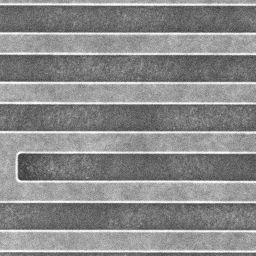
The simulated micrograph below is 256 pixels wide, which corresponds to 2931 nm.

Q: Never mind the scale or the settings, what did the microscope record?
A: groups of lines, slits or small figures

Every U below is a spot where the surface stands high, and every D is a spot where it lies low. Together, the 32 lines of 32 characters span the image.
UUUUUUUUUUUUUUUUUUUUUUUUUUUUUUUU
DDDDDDDDDDDDDDDDDDDDDDDDDDDDDDDD
DDDDDDDDDDDDDDDDDDDDDDDDDDDDDDDD
DDDDDDDDDDDDDDDDDDDDDDDDDDDDDDDD
UUUUUUUUUUUUUUUUUUUUUUUUUUUUUUUU
UUUUUUUUUUUUUUUUUUUUUUUUUUUUUUUU
UUUUUUUUUUUUUUUUUUUUUUUUUUUUUUUU
DDDDDDDDDDDDDDDDDDDDDDDDDDDDDDDD
DDDDDDDDDDDDDDDDDDDDDDDDDDDDDDDD
DDDDDDDDDDDDDDDDDDDDDDDDDDDDDDDD
UUUUUUUUUUUUUUUUUUUUUUUUUUUUUUUU
UUUUUUUUUUUUUUUUUUUUUUUUUUUUUUUU
UUUUUUUUUUUUUUUUUUUUUUUUUUUUUUUU
DDDDDDDDDDDDDDDDDDDDDDDDDDDDDDDD
DDDDDDDDDDDDDDDDDDDDDDDDDDDDDDDD
DDDDDDDDDDDDDDDDDDDDDDDDDDDDDDDD
DDDDDDDDDDDDDDDDDDDDDDDDDDDDDDDD
UUUUUUUUUUUUUUUUUUUUUUUUUUUUUUUU
UUUUUUUUUUUUUUUUUUUUUUUUUUUUUUUU
UUDDDDDDDDDDDDDDDDDDDDDDDDDDDDDD
UUDDDDDDDDDDDDDDDDDDDDDDDDDDDDDD
UUDDDDDDDDDDDDDDDDDDDDDDDDDDDDDD
UUUDDDDDDDDDDDDDDDDDDDDDDDDDDDDD
UUUUUUUUUUUUUUUUUUUUUUUUUUUUUUUU
UUUUUUUUUUUUUUUUUUUUUUUUUUUUUUUU
DDDDDDDDDDDDDDDDDDDDDDDDDDDDDDDD
DDDDDDDDDDDDDDDDDDDDDDDDDDDDDDDD
DDDDDDDDDDDDDDDDDDDDDDDDDDDDDDDD
DDDDDDDDDDDDDDDDDDDDDDDDDDDDDDDD
UUUUUUUUUUUUUUUUUUUUUUUUUUUUUUUU
UUUUUUUUUUUUUUUUUUUUUUUUUUUUUUUU
DDDDDDDDDDDDDDDDDDDDDDDDDDDDDDDD